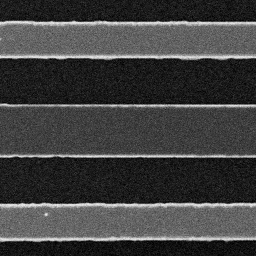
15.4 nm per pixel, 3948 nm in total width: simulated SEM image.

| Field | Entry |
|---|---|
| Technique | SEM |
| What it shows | lines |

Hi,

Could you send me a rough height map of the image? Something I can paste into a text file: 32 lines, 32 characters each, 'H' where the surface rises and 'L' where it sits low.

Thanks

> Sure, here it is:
LLLLLLLLLLLLLLLLLLLLLLLLLLLLLLLL
LLLLLLLLLLLLLLLLLLLLLLLLLLLLLLLL
LLLLLLLLLLLLLLLLLLLLLLLLLLLLLLLL
HHHHHHHHHHHHHHHHHHHHHHHHHHHHHHHH
HHHHHHHHHHHHHHHHHHHHHHHHHHHHHHHH
HHHHHHHHHHHHHHHHHHHHHHHHHHHHHHHH
HHHHHHHHHHHHHHHHHHHHHHHHHHHHHHHH
LLLLLLLLLLLLLLLLLLLLLLLLLLLLLLLL
LLLLLLLLLLLLLLLLLLLLLLLLLLLLLLLL
LLLLLLLLLLLLLLLLLLLLLLLLLLLLLLLL
LLLLLLLLLLLLLLLLLLLLLLLLLLLLLLLL
LLLLLLLLLLLLLLLLLLLLLLLLLLLLLLLL
LLLLLLLLLLLLLLLLLLLLLLLLLLLLLLLL
HHHHHHHHHHHHHHHHHHHHHHHHHHHHHHHH
HHHHHHHHHHHHHHHHHHHHHHHHHHHHHHHH
HHHHHHHHHHHHHHHHHHHHHHHHHHHHHHHH
HHHHHHHHHHHHHHHHHHHHHHHHHHHHHHHH
HHHHHHHHHHHHHHHHHHHHHHHHHHHHHHHH
HHHHHHHHHHHHHHHHHHHHHHHHHHHHHHHH
HHHHHHHHHHHHHHHHHHHHHHHHHHHHHHHH
LLLLLLLLLLLLLLLLLLLLLLLLLLLLLLLL
LLLLLLLLLLLLLLLLLLLLLLLLLLLLLLLL
LLLLLLLLLLLLLLLLLLLLLLLLLLLLLLLL
LLLLLLLLLLLLLLLLLLLLLLLLLLLLLLLL
LLLLLLLLLLLLLLLLLLLLLLLLLLLLLLLL
LLHLLHHLLLHHHLLLHLLHHHHHHHHHLHHH
HHHHHHHHHHHHHHHHHHHHHHHHHHHHHHHH
HHHHHHHHHHHHHHHHHHHHHHHHHHHHHHHH
HHHHHHHHHHHHHHHHHHHHHHHHHHHHHHHH
HHHHHHHHHHHHHHHHHHHHHHHHHHHHHHHH
LLLLLLLLLLLLLLLLLLLLLLLLLLLLLLLL
LLLLLLLLLLLLLLLLLLLLLLLLLLLLLLLL